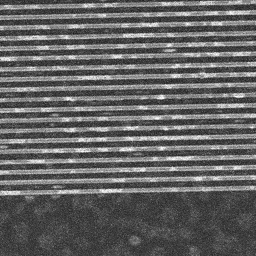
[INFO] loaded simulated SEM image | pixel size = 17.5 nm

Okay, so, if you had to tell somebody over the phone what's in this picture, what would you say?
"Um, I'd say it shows parallel lines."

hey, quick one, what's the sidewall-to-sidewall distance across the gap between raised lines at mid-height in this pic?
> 0.118 um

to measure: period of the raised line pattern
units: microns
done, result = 0.18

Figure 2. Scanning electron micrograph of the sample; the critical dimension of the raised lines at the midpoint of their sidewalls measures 59 nm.